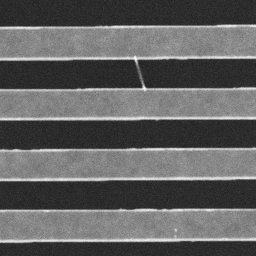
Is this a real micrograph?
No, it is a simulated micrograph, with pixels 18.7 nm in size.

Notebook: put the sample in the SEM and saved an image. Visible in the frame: lines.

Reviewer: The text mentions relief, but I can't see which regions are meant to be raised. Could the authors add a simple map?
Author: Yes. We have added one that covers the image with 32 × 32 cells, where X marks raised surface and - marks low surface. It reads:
--------------------------------
--------------------------------
--------------------------------
XXXXXXXXXXXXXXXXXXXXXXXXXXXXXXXX
XXXXXXXXXXXXXXXXXXXXXXXXXXXXXXXX
XXXXXXXXXXXXXXXXXXXXXXXXXXXXXXXX
XXXXXXXXXXXXXXXXXXXXXXXXXXXXXXXX
----------------XX--------------
--------------------------------
--------------------------------
--------------------------------
XXXXXXXXXXXXXXXXXXXXXXXXXXXXXXXX
XXXXXXXXXXXXXXXXXXXXXXXXXXXXXXXX
XXXXXXXXXXXXXXXXXXXXXXXXXXXXXXXX
XXXXXXXXXXXXXXXXXXXXXXXXXXXXXXXX
--------------------------------
--------------------------------
--------------------------------
-------------------------------X
XXXXXXXXXXXXXXXXXXXXXXXXXXXXXXXX
XXXXXXXXXXXXXXXXXXXXXXXXXXXXXXXX
XXXXXXXXXXXXXXXXXXXXXXXXXXXXXXXX
XXXXXXXXXXXXX-------------------
--------------------------------
--------------------------------
--------------------------------
XXXXXXXXXXXXXXXXXXXXXXXXXXXXXXXX
XXXXXXXXXXXXXXXXXXXXXXXXXXXXXXXX
XXXXXXXXXXXXXXXXXXXXXXXXXXXXXXXX
XXXXXXXXXXXXXXXXXXXXXXXXXXXXXXXX
--------------------------------
--------------------------------